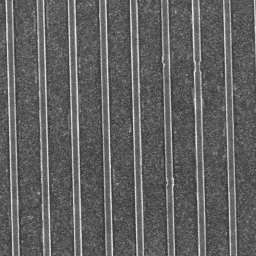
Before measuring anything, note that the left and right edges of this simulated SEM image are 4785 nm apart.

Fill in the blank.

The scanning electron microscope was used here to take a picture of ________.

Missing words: parallel lines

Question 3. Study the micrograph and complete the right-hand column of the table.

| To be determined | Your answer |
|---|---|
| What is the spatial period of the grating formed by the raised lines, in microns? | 0.581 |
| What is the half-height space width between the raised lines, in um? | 0.46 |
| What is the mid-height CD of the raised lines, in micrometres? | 0.129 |